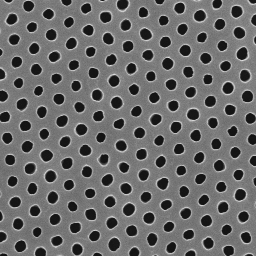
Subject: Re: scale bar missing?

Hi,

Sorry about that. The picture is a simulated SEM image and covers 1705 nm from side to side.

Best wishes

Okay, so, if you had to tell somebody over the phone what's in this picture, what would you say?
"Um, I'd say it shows a regular array of holes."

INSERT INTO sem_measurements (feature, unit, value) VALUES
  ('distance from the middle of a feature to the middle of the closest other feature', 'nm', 140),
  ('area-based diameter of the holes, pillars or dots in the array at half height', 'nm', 70.1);